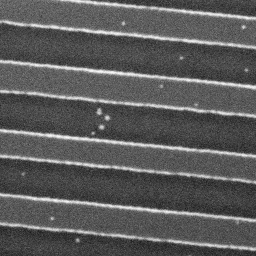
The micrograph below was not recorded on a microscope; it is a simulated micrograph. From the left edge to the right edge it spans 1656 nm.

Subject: lines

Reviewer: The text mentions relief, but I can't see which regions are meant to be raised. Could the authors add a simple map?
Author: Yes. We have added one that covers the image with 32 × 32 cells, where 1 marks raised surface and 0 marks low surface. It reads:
11111111111111000000000000000000
11111111111111111111111100000000
11111111111111111111111111111111
00000001111111111111111111111111
00000000000000000111111111111111
00000000000000000000000000011111
00000000000000000000000000000000
00000000000000000000000000000000
11111111100000000000000000000000
11111111111111111110000000000000
11111111111111111111111111111000
01111111111111111111111111111111
00000000000111111111111111111111
00000000000000000000011111111111
00000000000000000000000000000001
00000000000000000000000000000000
11100000000000000000000000000000
11111111111100000000000000000000
11111111111111111111110000000000
11111111111111111111111111111111
00000000011111111111111111111111
00000000000000000001111111111111
00000000000000000000000000000111
00000000000000000000000000000000
11100000000000000000000000000000
11111111111100000000000000000000
11111111111111111111110000000000
11111111111111111111111111111110
00001111111111111111111111111111
00000000000000011111111111111111
00000000000000000000000011111111
00000000000000000000000000000000